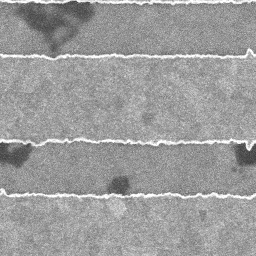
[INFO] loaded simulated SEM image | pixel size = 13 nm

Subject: one or a few lines or trenches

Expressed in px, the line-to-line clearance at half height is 53.4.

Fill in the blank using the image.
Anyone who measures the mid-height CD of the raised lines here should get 1.12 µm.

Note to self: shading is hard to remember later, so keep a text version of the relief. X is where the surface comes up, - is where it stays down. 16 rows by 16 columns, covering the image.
----------------
----------------
----------------
X---X-XXX------X
XXXXXXXXXXXXXXXX
XXXXXXXXXXXXXXXX
XXXXXXXXXXXXXXXX
XXXXXXXXXXXXXXXX
XXXXXXXXXXXXXXXX
----------------
----------------
----------------
XXXXXXXXXXXXXXXX
XXXXXXXXXXXXXXXX
XXXXXXXXXXXXXXXX
XXXXXXXXXXXXXXXX